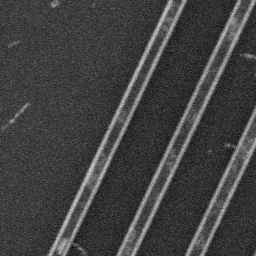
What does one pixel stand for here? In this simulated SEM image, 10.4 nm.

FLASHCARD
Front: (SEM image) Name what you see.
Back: parallel lines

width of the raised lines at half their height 12.5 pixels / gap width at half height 514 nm